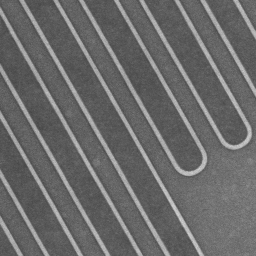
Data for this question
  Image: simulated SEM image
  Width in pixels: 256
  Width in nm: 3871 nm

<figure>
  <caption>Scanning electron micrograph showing parallel lines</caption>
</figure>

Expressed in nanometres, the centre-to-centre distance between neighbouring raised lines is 789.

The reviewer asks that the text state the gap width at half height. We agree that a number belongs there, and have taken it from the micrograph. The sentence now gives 23.5 pixels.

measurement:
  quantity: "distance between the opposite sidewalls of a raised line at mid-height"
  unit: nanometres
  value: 441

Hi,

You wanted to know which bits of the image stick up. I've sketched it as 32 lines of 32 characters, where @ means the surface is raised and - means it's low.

---@@@@---@@@@@---@@@@----@@@@--
----@@@@---@@@@----@@@@---@@@@--
@---@@@@----@@@@---@@@@----@@@@-
@----@@@@---@@@@----@@@@---@@@@-
@@---@@@@@---@@@@---@@@@@---@@@@
@@----@@@@---@@@@@---@@@@---@@@@
@@@---@@@@@---@@@@---@@@@@---@@@
@@@@---@@@@---@@@@@---@@@@----@@
@@@@----@@@@---@@@@----@@@@---@@
-@@@@---@@@@----@@@@---@@@@----@
-@@@@----@@@@---@@@@@---@@@@---@
--@@@@---@@@@----@@@@---@@@@----
--@@@@----@@@@---@@@@@---@@@@---
---@@@@---@@@@@---@@@@---@@@@@--
----@@@@---@@@@---@@@@@---@@@@--
@---@@@@----@@@@---@@@@----@@@@-
@----@@@@---@@@@----@@@@---@@@@-
@@---@@@@----@@@@---@@@@@---@@@-
@@----@@@@---@@@@@---@@@@-------
@@@---@@@@----@@@@---@@@@@------
@@@@---@@@@---@@@@@---@@@-------
@@@@----@@@----@@@@----@--------
-@@@@---@@@@----@@@@------------
-@@@@----@@@@---@@@@------------
--@@@@---@@@@----@@@@-----------
--@@@@----@@@@---@@@@-----------
---@@@@---@@@@----@@@@----------
---@@@@@---@@@@---@@@@@---------
@---@@@@----@@@@---@@@@---------
@----@@@@---@@@@----@@@@--------
@@---@@@@----@@@@---@@@@--------
@@----@@@@---@@@@----@@@@-------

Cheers